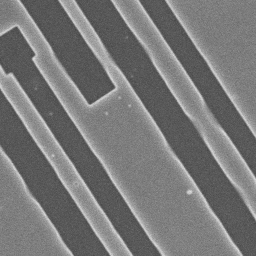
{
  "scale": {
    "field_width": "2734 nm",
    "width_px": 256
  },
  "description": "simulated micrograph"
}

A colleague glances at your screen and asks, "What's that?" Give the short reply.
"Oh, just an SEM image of groups of lines, slits or small figures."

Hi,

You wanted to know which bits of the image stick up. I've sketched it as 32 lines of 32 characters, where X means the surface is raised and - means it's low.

XXX-----XX----XXXX---XXXXXXXXXXX
XXX-----XX-----XXX----XXXXXXXXXX
XXXX-----XX-----XXX---XXXXXXXXXX
XXXXX-----XX----XXXX---XXXXXXXXX
---XX-----XX-----XXX----XXXXXXXX
----XX-----XX-----XXX---XXXXXXXX
----XXX-----X------XXX---XXXXXXX
----XXX-----XX-----XXX----XXXXXX
-----XXX-----XX-----XXX---XXXXXX
XX---XXX------XX----XXXX---XXXXX
XX----XXX-----XX-----XXX----XXXX
XXX----XXX----XXX----XXXX---XXXX
-XXX---XXXX-XXXXXX----XXX----XXX
--XX----XXXXXXXXXX-----XXX----XX
--XXX----XXXXXXXXXX-----XX----XX
---XXX---XXXXXXXXXX-----XXX----X
----XX----XXXXXXXXXX-----XXX----
----XXX----XXXXXXXXXX-----XXX---
-----XXX---XXXXXXXXXX-----XXX---
X-----XX----XXXXXXXXXX-----XXX--
XX----XXX----XXXXXXXXXX----XXXX-
XX-----XXX---XXXXXXXXXX-----XXX-
XXX-----XX----XXXXXXXXXX-----XXX
XXX-----XXX----XXXXXXXXXX-----XX
XXXX-----XXX---XXXXXXXXXX-----XX
XXXXX-----XX----XXXXXXXXXX-----X
XXXXXX----XXX----XXXXXXXXXX----X
XXXXXX-----XXX---XXXXXXXXXX-----
XXXXXXX-----XX----XXXXXXXXXX----
XXXXXXX-----XXX----XXXXXXXXXX---
XXXXXXXX-----XXX---XXXXXXXXXX---
XXXXXXXXX-----XX----XXXXXXXXXX--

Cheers